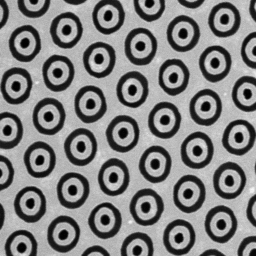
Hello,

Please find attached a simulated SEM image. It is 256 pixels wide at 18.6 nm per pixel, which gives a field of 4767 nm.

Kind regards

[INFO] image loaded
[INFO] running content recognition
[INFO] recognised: a regular array of ring-shaped grooves with a dot in the middle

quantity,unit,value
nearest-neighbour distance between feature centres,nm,803